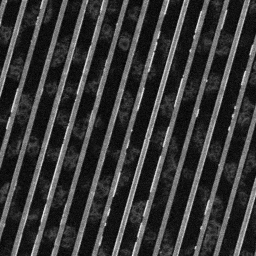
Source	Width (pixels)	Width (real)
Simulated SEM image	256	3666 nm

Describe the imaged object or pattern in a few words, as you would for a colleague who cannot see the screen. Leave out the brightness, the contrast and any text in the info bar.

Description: parallel lines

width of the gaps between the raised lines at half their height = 0.215 microns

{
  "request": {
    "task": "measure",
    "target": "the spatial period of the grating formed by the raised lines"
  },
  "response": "0.279 µm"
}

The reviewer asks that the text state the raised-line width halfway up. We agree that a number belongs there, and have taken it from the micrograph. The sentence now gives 60.3 nanometers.